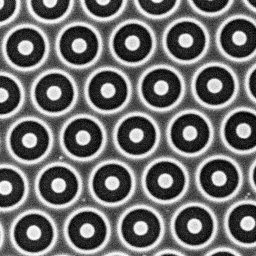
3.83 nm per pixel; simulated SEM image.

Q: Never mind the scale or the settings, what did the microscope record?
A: an array of small figures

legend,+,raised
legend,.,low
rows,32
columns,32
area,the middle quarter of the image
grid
+++..+++++++++++++++++++++++++++
++++++++++..++++++++++.....+++++
++++++++......++++++........++++
.++++++........+++++.........+++
..++++..........+++.....+....+++
..++++....++....+++....+++....++
...+++...++++...+++....+++....++
...+++....++....+++.....+....+++
...+++..........++++.........+++
..++++.........+++++........++++
..+++++.......+++++++......+++++
.++++++++....+++++++++++++++++++
++++++++++++++++++++++++++++++..
+++...+++++++++......+++++++....
++......++++++........+++++.....
+........+++++.........++++.....
.........++++..........+++....++
...+++....+++....+++...+++....++
...+++....+++....++....+++.....+
....++....+++..........++++.....
..........++++.........++++.....
.........+++++........++++++....
+.......++++++++....++++++++++..
++++..++++++++++++++++++++++++++
+++++++++++++++++++++++.....++++
+++++++++......+++++++.......+++
..++++++........+++++.........++
...++++..........+++..........++
...++++....+.....+++....+++....+
....+++....+++...+++....+++....+
....+++....+++...+++....++....++
....+++..........++++.........++